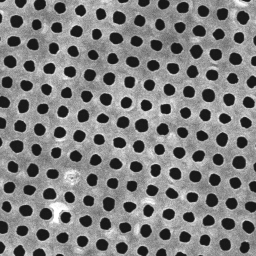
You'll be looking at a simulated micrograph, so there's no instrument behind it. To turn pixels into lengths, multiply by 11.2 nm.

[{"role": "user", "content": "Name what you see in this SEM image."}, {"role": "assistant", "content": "a regular array of holes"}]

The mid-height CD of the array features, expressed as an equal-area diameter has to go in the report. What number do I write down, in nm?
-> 134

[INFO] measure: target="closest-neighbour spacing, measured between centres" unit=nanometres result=223